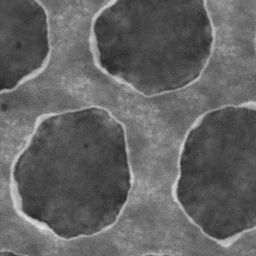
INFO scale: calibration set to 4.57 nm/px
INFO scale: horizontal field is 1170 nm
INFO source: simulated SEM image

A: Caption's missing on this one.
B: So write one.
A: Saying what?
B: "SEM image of holes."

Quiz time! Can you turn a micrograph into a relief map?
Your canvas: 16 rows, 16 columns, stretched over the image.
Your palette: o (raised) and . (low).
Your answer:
...oooo......ooo
...ooo.......ooo
...ooo.......ooo
...ooo.......ooo
..ooooo......ooo
.ooooooo...ooooo
oooooooooooooooo
ooo....oooooo...
oo......oooo....
o.......ooo.....
o.......ooo.....
o.......ooo.....
o.......ooo.....
oo.....ooooo....
ooo...ooooooo..o
oooooooooooooooo